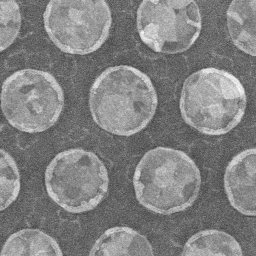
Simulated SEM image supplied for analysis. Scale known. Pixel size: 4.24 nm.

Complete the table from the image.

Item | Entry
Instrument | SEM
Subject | raised bodies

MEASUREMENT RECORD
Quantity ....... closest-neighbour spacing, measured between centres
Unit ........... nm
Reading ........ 381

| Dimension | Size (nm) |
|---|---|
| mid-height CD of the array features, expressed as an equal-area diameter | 280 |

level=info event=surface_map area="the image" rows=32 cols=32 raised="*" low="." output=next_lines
**....*******.....******.....***
**....********...********...****
***..*********...********...****
**....********...********...****
**....*******.....*******....***
*......******.....******.....***
.........**.........**.........*
................................
..............***...............
.*****.......*****......*****...
*******.....*******....*******..
********...********....********.
********...*********..*********.
********...********...*********.
.******.....*******....*******..
.******.....******......******..
..............***.........**....
................................
....................*...........
*......*****......*****.......**
**....*******....*******.....***
**....*******....********...****
**....*******....********...****
**....*******....********...****
**....*******....********....***
*......*****......******.....***
....................**........**
................................
................................
..****.......*****......*****...
.******.....*******....*******..
********...********....*******..